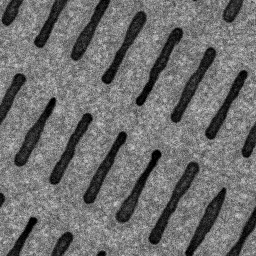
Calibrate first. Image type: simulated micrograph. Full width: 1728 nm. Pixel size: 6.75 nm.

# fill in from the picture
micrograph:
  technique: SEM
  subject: a regular array of holes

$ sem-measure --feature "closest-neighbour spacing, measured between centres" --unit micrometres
0.264